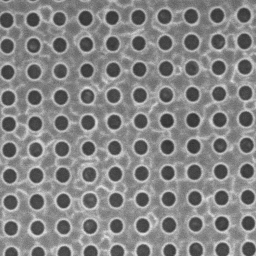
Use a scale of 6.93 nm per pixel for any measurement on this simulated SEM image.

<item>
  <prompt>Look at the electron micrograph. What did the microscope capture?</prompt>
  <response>a regular array of holes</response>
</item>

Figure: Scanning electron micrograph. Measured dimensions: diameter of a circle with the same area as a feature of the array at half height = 106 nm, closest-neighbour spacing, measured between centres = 0.179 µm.